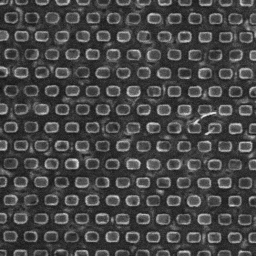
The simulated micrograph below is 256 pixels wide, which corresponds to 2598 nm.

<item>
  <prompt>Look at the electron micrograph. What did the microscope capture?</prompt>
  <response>a regular array of raised bodies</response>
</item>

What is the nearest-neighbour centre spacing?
205 nm